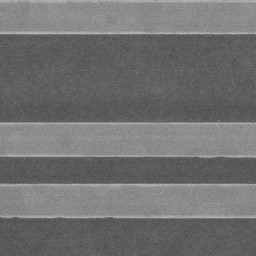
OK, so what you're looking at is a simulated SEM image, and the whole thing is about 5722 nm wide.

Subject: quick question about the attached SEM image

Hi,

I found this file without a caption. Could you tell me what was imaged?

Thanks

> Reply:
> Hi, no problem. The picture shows lines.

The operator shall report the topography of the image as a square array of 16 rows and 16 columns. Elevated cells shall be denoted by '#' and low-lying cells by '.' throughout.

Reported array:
################
################
................
................
................
................
................
................
################
################
................
................
################
################
................
................